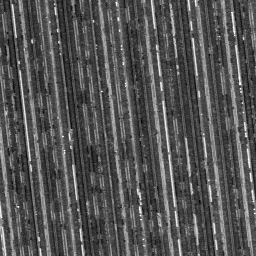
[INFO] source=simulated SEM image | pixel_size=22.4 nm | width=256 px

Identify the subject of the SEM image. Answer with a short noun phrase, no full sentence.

parallel lines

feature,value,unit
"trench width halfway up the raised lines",170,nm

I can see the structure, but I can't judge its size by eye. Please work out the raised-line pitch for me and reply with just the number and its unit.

196 nm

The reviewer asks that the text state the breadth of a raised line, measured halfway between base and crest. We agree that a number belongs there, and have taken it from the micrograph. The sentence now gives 1.86 pixels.